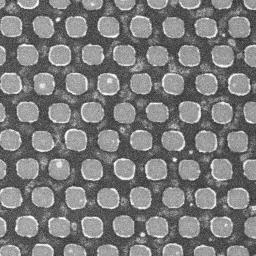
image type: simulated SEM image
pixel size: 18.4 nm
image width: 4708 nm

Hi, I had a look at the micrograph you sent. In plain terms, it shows a regular array of raised bodies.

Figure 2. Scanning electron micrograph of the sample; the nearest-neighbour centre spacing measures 0.591 micrometres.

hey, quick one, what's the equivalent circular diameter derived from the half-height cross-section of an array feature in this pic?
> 394 nanometers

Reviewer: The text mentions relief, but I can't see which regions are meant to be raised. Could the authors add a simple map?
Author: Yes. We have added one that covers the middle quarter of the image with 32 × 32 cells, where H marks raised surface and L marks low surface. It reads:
LLLLLLLLLLLLLLLLLLLLLLLLLLLLLLLL
LLLLLLLLLLLLLLLLLLLLLLLLLLLLLLLL
LLHHLLLLLLHLLLLLLLLLHLLLLLLLLLLL
LHHHHLLLLHHHHLLLLHHHHLLLLHHHHLLL
HHHHHHLLLHHHHHLLLHHHHHLLLHHHHHLL
LHHHHHLLLHHHHHLLLHHHHHLLLHHHHHLL
LHHHHHLLLHHHHHLLLHHHHHLLLHHHHHLL
LLLLLLLLLLLLLLLLLLLHLLLLLLLHHLLL
LLLLLLLLLLLLLLLLLLLLLLLLLLLLLLLL
LLLLLLLLLLLLLLLLLLLLLLLLLLLLLLLL
HLLLLHHHHLLLLHHHHLLLLHHHHLLLLHHH
HLLLLHHHHHLLLHHHHHLLLHHHHHLLLHHH
HLLLLHHHHHLLLHHHHHLLLHHHHHLLLHHH
HLLLLHHHHHLLLHHHHLLLLHHHHHLLLHHH
HLLLLLLHLLLLLLHHHLLLLLLLLLLLLLLH
LLLLLLLLLLLLLLLLLLLLLLLLLLLLLLLL
LLLLLLLLLLLLLLLLLLLLLLLLLLLLLLLL
LHHHHLLLLHHHHLLLLHHHHLLLLHHHHLLL
LHHHHHLLLHHHHHLLLHHHHHLLLHHHHHLL
LHHHHHLLLHHHHHLLLHHHHHLLLHHHHHLL
LHHHHLLLLHHHHHLLLHHHHHLLLHHHHHLL
LLLHHLLLLLHHHLLLLLLLLLLLLLLLLLLL
LLLLLLLLLLLLLLLLLLLLLLLLLLLLLLLL
LLLLLLLLLLLLLLLLLLLLLLLLLLLLLLLL
HLLLLHHHHLLLLHHHHLLLLHHHHLLLLHHH
HLLLLHHHHLLLLHHHHHLLLHHHHHLLLHHH
HLLLLHHHHLLLLHHHHHLLLHHHHHLLLHHH
HLLLLHHHHLLLLHHHHLLLLHHHHHLLLHHH
HLLLLHHHHLLLLLHHHLLLLHHHHLLLLLHH
LLLLLLLLLLLLLLLLLLLLLLLLLLLLLLLL
LLLLLLLLLLLLLLLLLLLLLLLLLLLLLLLL
LHHHHLLLLHHHHLLLLHHHHLLLLHHHHLLL